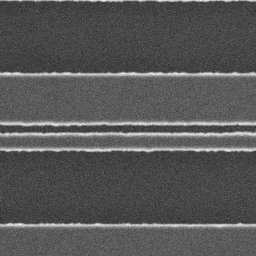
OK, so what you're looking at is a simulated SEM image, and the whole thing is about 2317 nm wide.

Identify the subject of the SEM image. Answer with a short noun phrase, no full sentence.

lines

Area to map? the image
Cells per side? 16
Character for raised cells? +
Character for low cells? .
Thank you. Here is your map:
................
................
................
................
................
++++++++++++++++
++++++++++++++++
++++++++++++++++
++++++++++++++++
................
................
................
................
................
++++++++++++++++
++++++++++++++++